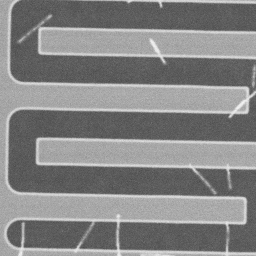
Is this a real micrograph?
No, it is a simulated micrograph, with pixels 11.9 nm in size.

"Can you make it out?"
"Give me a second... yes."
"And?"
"groups of lines, slits or small figures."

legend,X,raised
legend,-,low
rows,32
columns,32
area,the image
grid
XX------------------------------
X-------------------------------
X-------------------------------
X-------------------------------
X----XXXXXXXXXXXXXXXXXXXXXXXXXXX
X----XXXXXXXXXXXXXXXXXXXXXXXXXXX
X----XXXXXXXXXXXXXXXXXXXXXXXXXXX
X-------------------------------
X-------------------------------
X-------------------------------
XXXXX---------------------------
XXXXXXXXXXXXXXXXXXXXXXXXXXXXXXX-
XXXXXXXXXXXXXXXXXXXXXXXXXXXXXXX-
XXX--XXXXXXXXXXXXXXXXXXXXXXXXXX-
X-------------------------------
X-------------------------------
X-------------------------------
X----XXXXXXXX-------------------
X----XXXXXXXXXXXXXXXXXXXXXXXXXXX
X----XXXXXXXXXXXXXXXXXXXXXXXXXXX
X------XXXXXXXXXXXXXXXXXXXXXXXXX
X-------------------------------
X-------------------------------
X-------------------------------
XXXXXXXXXXXXXXX-----------------
XXXXXXXXXXXXXXXXXXXXXXXXXXXXXXX-
XXXXXXXXXXXXXXXXXXXXXXXXXXXXXXX-
XX-------XXXXXXXXXXXXXXXXXXXXXX-
X-------------------------------
X-------------------------------
X-------------------------------
XXXXXXXXXXXXXXXXXXXXXXX---------